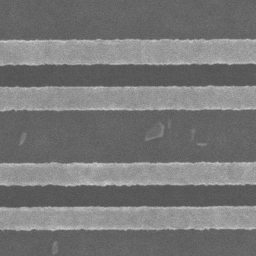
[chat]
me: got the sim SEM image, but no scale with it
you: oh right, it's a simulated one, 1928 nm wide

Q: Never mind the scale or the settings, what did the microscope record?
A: lines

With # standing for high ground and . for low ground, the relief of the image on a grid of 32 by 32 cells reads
................................
................................
................................
................................
................................
################################
################################
################################
................................
................................
................................
################################
################################
################################
................................
................................
................................
................................
................................
................................
################################
################################
################################
................................
................................
................................
################################
################################
################################
................................
................................
................................